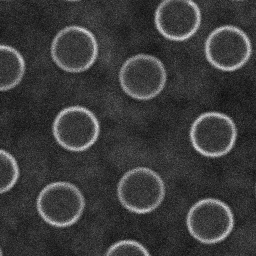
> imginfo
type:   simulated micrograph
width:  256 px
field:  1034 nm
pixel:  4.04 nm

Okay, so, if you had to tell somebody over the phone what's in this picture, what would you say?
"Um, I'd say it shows a regular array of raised bodies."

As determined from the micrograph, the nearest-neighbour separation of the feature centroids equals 308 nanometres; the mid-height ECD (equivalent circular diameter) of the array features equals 0.174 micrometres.